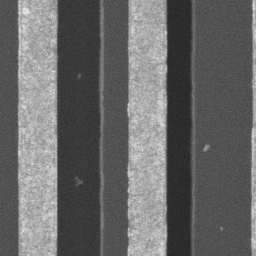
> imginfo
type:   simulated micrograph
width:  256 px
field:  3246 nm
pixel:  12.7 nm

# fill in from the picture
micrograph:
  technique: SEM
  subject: lines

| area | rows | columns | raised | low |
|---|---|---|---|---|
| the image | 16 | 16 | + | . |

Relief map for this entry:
++++..++++..++++
++++..++++..++++
++++..++++..++++
++++..++++..++++
++++..++++..++++
++++..++++..++++
++++..++++..++++
++++..++++..++++
++++..++++..++++
++++..++++..++++
++++..++++..++++
++++..++++..++++
++++..++++..++++
++++..++++..++++
++++..++++..++++
++++..++++..++++